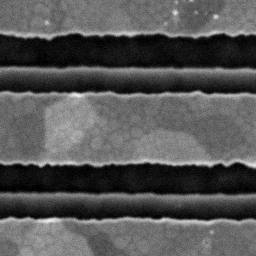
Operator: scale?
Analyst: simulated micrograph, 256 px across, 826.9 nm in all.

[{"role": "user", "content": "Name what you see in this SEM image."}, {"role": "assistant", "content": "lines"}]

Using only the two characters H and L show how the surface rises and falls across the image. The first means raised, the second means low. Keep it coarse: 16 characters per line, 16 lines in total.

HHHHHHHHHHHHHHHH
HHHHHHHHHHHHHHHH
LLLLLLLLLLLLLLLL
LLLLLLLLLLLLLLLL
LLLLLLLLLLLLLLLL
LLLLLLLLLLLLLLLL
HHHHHHHHHHHHHHHH
HHHHHHHHHHHHHHHH
HHHHHHHHHHHHHHHH
HHHHHHHHHHHHHHHH
LLLLLLLLLLLLLLLL
LLLLLLLLLLLLLLLL
LLLLLLLLLLLLLLLL
LLLLLLLLLLLLLLLL
HHHHHHHHHHHHHHHH
HHHHHHHHHHHHHHHH